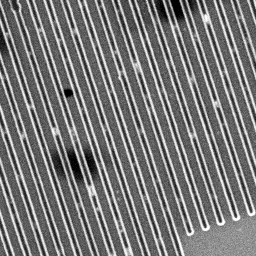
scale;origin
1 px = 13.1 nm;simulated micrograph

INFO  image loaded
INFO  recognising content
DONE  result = parallel lines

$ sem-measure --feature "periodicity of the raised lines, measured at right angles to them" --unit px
16.2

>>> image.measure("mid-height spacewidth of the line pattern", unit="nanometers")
134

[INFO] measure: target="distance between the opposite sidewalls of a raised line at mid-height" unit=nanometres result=77.6